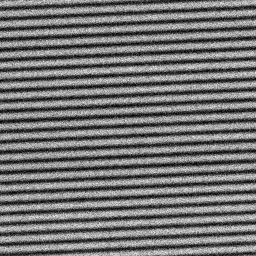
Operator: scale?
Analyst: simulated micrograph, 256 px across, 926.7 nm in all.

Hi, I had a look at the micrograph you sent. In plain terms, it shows parallel lines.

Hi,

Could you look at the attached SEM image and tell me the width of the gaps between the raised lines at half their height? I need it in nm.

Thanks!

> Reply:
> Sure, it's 13.6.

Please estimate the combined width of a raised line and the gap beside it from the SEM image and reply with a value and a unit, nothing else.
37.1 nm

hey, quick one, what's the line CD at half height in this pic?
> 23.5 nm